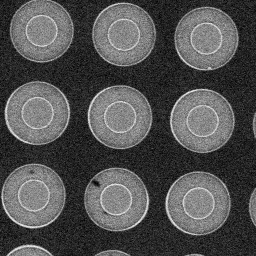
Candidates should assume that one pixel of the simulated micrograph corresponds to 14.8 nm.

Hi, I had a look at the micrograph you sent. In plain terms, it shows an array of small figures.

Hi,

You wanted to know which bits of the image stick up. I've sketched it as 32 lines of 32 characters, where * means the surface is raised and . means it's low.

***....********.****************
**......*****.....******....****
**.......***.......****......***
*........***.......***.......***
*........***.......***........**
**.......***.......***........**
**......****.......***.......***
****..*******.....*****......***
*************************..*****
********************************
***...**************************
**......*****....*******...*****
*.......****......****......****
*........**........***.......***
*........**........**........***
*.......***........**........***
**......****......****.......***
***....*****......****......****
**************..*******....*****
********************************
********************************
**.....******...****************
*.......****......****.....*****
........***.......***.......****
........***.......***........***
........***.......***........**.
*.......***.......***........**.
**.....*****......***.......****
*************...******.....*****
********************************
********************************
**....*******..*****************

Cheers